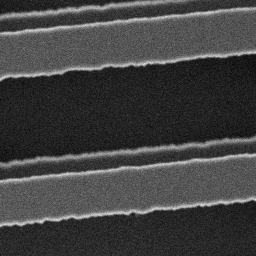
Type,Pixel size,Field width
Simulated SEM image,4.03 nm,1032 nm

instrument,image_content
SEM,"lines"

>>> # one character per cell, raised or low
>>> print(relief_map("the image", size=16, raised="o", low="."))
................
.....ooooooooooo
oooooooooooooooo
oooooooooooooo..
oooo............
................
................
................
................
................
.......ooooooooo
oooooooooooooooo
oooooooooooooooo
oooooo..........
................
................